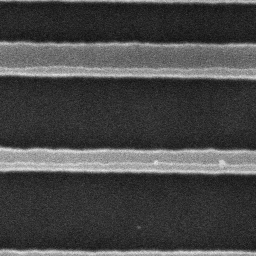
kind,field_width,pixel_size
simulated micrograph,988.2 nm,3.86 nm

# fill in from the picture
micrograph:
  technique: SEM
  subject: lines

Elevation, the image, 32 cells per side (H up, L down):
LLLLLLLLLLLLLLLLLLLLLLLLLLLLLLLL
LLLLLLLLLLLLLLLLLLLLLLLLLLLLLLLL
LLLLLLLLLLLLLLLLLLLLLLLLLLLLLLLL
LLLLLLLLLLLLLLLLLLLLLLLLLLLLLLLL
LLLLLLLLLLLLLLLLLLLLLLLLLLLLLLLL
HLHHLLLLLLLLLLLLHLLLLLLLLLLLLLLL
HHHHHHHHHHHHHHHHHHHHHHHHHHHHHHHH
HHHHHHHHHHHHHHHHHHHHHHHHHHHHHHHH
HHHHHHHHHHHHHHHHHHHHHHHHHHHHHHHH
LLLLLLLLLLLLLLLLLLHHHHHHHHHHHHHH
LLLLLLLLLLLLLLLLLLLLLLLLLLLLLLLL
LLLLLLLLLLLLLLLLLLLLLLLLLLLLLLLL
LLLLLLLLLLLLLLLLLLLLLLLLLLLLLLLL
LLLLLLLLLLLLLLLLLLLLLLLLLLLLLLLL
LLLLLLLLLLLLLLLLLLLLLLLLLLLLLLLL
LLLLLLLLLLLLLLLLLLLLLLLLLLLLLLLL
LLLLLLLLLLLLLLLLLLLLLLLLLLLLLLLL
LLLLLLLLLLLLLLLLLLLLLLLLLLLLLLLL
LLLLLLLLLLLLLLLLLLLLLLLLLLLLLLLL
HHHHHHHHHHHHHHHHHHHHHHHHHHHHHHHH
HHHHHHHHHHHHHHHHHHHHHHHHHHHHHHHH
LLLLLLLLLLLLLLLLLLLLLLLLLLHLLLHH
LLLLLLLLLLLLLLLLLLLLLLLLLLLLLLLL
LLLLLLLLLLLLLLLLLLLLLLLLLLLLLLLL
LLLLLLLLLLLLLLLLLLLLLLLLLLLLLLLL
LLLLLLLLLLLLLLLLLLLLLLLLLLLLLLLL
LLLLLLLLLLLLLLLLLLLLLLLLLLLLLLLL
LLLLLLLLLLLLLLLLLLLLLLLLLLLLLLLL
LLLLLLLLLLLLLLLLLLLLLLLLLLLLLLLL
LLLLLLLLLLLLLLLLLLLLLLLLLLLLLLLL
LLLLLLLLLLLLLLLLLLLLLLLLLLLLLLLL
HHLLHLHLLLLLLLLLLLLLLLLLLLLLLLLL